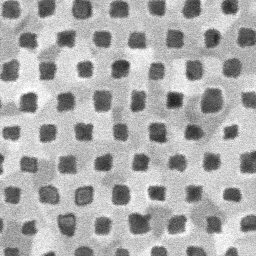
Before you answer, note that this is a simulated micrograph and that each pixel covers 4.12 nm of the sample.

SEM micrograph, a regular array of holes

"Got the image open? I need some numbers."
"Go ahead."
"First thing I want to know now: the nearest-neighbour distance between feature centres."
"144 nm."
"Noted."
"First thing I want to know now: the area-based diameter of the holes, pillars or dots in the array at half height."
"0.0816 microns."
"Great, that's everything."